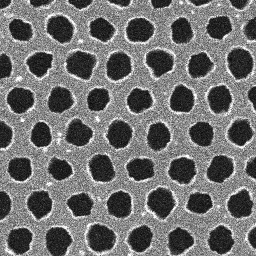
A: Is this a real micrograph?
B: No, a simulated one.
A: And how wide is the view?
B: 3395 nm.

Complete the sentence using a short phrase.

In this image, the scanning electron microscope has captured a regular array of holes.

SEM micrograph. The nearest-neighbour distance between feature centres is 511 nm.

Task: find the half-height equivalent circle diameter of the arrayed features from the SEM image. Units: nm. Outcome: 338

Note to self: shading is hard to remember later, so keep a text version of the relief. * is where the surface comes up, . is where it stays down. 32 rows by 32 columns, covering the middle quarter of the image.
*.......***......****......****.
*......****......*****.....****.
**.....****.....*******..******.
****...*****...*****************
********************************
*****************************.**
.******...*******....*******....
..****.....*****.....******.....
..****.....*****......*****.....
..****.....*****......****......
..****.....*****.....*****......
.******...*******...*******.....
********************************
********************************
**...*******...*****************
*.....*****.....******...*******
*......****......****.....*****.
*......****......****......*****
.......****......****......*****
*.....*****.....*****.....******
***..*******....*****....*******
**********************.*********
********************************
*******....******************.**
.*****......*****.....*****.....
..****......****......*****.....
..*****......***.......***......
..*****......***......****......
.******.....*****.....*****.....
********..*******************..*
********************************
***********************...******